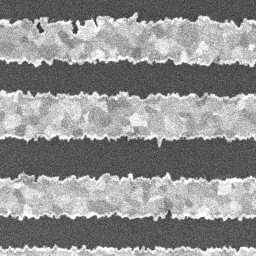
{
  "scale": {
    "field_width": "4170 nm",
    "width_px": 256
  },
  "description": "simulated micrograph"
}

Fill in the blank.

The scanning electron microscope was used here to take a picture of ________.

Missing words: one or a few lines or trenches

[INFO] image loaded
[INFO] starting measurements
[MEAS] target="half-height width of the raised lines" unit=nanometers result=637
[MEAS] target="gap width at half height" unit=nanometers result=578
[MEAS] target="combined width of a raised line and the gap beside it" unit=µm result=1.27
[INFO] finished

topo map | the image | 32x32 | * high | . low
................................
................................
...*.*......**.**........*......
*********.**********************
********************************
********************************
********************************
.******.****.**.****************
................................
................................
................................
...............*................
********************************
********************************
********************************
********************************
********************************
................................
................................
................................
................................
................................
**************************...***
********************************
********************************
********************************
********************************
................................
................................
................................
................................
********************************